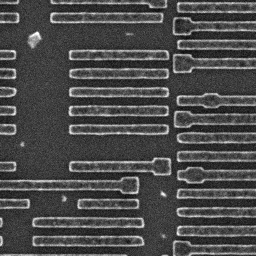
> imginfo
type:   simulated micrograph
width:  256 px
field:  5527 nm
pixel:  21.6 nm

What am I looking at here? wiring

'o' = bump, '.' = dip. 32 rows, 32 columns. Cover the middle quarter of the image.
...........................ooooo
..oooooooooooooooooooooooo.ooooo
..oooooooooooooooooooooooo......
..oooooooooooooooooooooooo......
................................
................................
..oooooooooooooooooooooooo......
..oooooooooooooooooooooooo......
.............................ooo
............................oooo
......oooo..........oooo........
.ooooooooooooooooooooooooo......
.ooooooooooooooooooooooooo..oooo
............................oooo
............................oooo
..oooooooooooooooooooooooo..ooo.
..oooooooooooooooooooooooo......
........oo.........ooooo.....ooo
.............................ooo
.............................ooo
................................
................................
.............................ooo
.............................ooo
..ooooooooooooooooooooooooo.....
..ooooooooooooooooooooooooo.....
..ooooooooooooooooooooooooo...oo
.......................ooo...ooo
...............ooo...........ooo
ooooooooooooooooooo............o
ooooooooooooooooooo.............
..............ooooo..........ooo